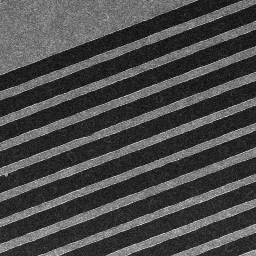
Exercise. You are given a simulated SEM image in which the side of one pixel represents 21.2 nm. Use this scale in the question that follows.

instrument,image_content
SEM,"parallel lines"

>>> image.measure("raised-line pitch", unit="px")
23.8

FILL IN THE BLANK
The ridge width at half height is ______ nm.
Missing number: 161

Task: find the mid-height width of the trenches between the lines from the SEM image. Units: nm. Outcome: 345